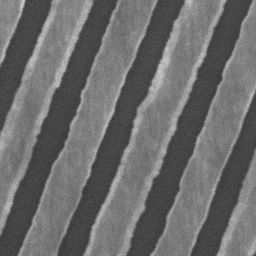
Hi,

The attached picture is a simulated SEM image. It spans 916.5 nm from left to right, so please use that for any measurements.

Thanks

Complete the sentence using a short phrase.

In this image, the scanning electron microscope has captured lines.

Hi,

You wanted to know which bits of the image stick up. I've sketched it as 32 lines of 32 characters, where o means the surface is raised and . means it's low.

ooo....oooo....oooo....ooooo...o
ooo....oooo...ooooo....ooooo...o
oo....oooo....ooooo...ooooo...oo
oo....oooo...ooooo....ooooo...oo
o....ooooo...ooooo....oooo....oo
o....oooo....oooo....ooooo...ooo
o...ooooo...ooooo....ooooo...ooo
....oooo....ooooo....oooo....ooo
....oooo...ooooo....ooooo...oooo
...oooo....ooooo....oooo....oooo
...oooo....oooo....ooooo...ooooo
...ooo....ooooo....oooo....ooooo
..oooo....ooooo...ooooo....oooo.
..oooo....oooo....ooooo...ooooo.
.oooo....ooooo...ooooo....ooooo.
.oooo....ooooo...ooooo....oooo..
.oooo....oooo....ooooo...ooooo..
oooo....ooooo....oooo....ooooo..
oooo....oooo....ooooo...ooooo...
oooo...ooooo....oooo....ooooo...
ooo....ooooo...ooooo...ooooo....
ooo...ooooo....ooooo...ooooo....
oo....ooooo...ooooo....oooo....o
oo....oooo....oooo....ooooo....o
o....ooooo....oooo....ooooo...oo
o....ooooo...ooooo....oooo....oo
o....oooo....oooo....ooooo....oo
o...ooooo...ooooo....ooooo...ooo
....oooo....ooooo....oooo....ooo
...ooooo...ooooo....ooooo...oooo
...ooooo...ooooo....oooo....oooo
..ooooo....ooooo...ooooo....oooo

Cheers